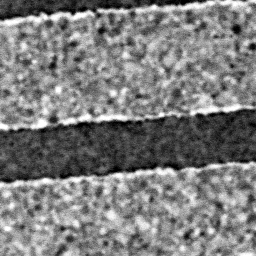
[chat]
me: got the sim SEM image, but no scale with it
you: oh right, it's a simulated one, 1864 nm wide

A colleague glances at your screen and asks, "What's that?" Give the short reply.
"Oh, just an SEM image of one or a few lines or trenches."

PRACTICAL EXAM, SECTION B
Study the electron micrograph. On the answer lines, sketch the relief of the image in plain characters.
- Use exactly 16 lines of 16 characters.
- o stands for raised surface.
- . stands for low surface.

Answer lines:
.........ooooooo
oooooooooooooooo
oooooooooooooooo
oooooooooooooooo
oooooooooooooooo
oooooooooooooooo
oooooooooooooooo
ooooooo.........
................
................
.............ooo
oooooooooooooooo
oooooooooooooooo
oooooooooooooooo
oooooooooooooooo
oooooooooooooooo